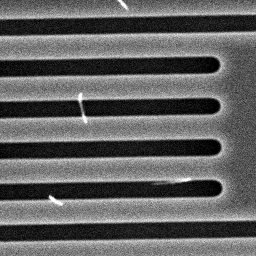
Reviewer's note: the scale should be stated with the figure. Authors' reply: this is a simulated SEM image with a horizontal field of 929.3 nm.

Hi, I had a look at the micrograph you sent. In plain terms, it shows groups of lines, slits or small figures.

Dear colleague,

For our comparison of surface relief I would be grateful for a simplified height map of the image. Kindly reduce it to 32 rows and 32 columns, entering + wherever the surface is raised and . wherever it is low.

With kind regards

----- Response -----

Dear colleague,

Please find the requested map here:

++++++++++++++++++++++++++++++++
++++++++++++++++++++++++++++++++
................................
................................
......++++++++++++++++++++++++++
++++++++++++++++++++++++++++++++
++++++++++++++++++++++++++++++++
...........................+++++
............................++++
...............+++++++++++++++++
++++++++++++++++++++++++++++++++
++++++++++++++++++++++++++++++++
++++++++.++................+++++
............................++++
........................++++++++
++++++++++++++++++++++++++++++++
++++++++++++++++++++++++++++++++
+++++++++++++++++..........+++++
............................++++
..........................++++++
++++++++++++++++++++++++++++++++
++++++++++++++++++++++++++++++++
+++++++++++++++++++...++...+++++
............................++++
...........................+++++
++++++++++++++++++++++++++++++++
++++++++++++++++++++++++++++++++
++++++++++++++++++++++++++++++..
................................
................................
++++++++++++++++++++++++++++++++
++++++++++++++++++++++++++++++++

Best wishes